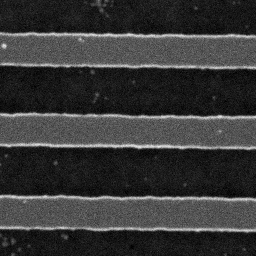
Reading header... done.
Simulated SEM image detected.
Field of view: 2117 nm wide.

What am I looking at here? lines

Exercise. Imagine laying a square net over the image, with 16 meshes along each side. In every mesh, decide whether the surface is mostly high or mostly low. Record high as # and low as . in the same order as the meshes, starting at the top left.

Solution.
................
................
################
################
................
................
................
################
################
................
................
................
################
################
................
................